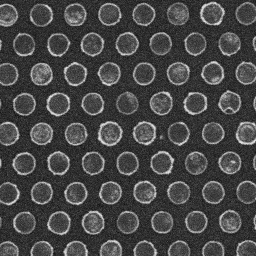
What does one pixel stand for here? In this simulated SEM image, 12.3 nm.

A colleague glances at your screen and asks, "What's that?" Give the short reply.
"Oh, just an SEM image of a regular array of raised bodies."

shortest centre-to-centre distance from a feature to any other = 416 nm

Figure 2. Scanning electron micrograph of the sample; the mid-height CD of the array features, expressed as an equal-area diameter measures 273 nm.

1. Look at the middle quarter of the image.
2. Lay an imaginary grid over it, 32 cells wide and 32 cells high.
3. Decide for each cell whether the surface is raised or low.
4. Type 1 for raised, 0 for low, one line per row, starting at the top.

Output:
01111000011110000011110000011110
11111100011111000111111000111110
11111100011111000111111000111110
11111000011111000011110000111110
01111000011110000011110000011100
00000000000000000000000000000000
00000000000000000000000000000000
00000011100000011000000111000001
10000111100000111100001111100001
10001111110001111100001111100011
10001111110001111100001111100011
10000111110000111100001111100011
00000001000000000000000111000001
00000000000000000000000000000000
00000000001110000001100000000000
01111000011111000011111000011110
01111000011111000011111000111110
11111100011111100111111000111110
01111000011111000011111000111110
01111000011110000001110000011100
00000000000000000000000000000000
00000000000000000000000000000000
00000011100000111100000111000000
10000111110001111100001111100001
10000111110001111100001111100011
10000111110001111100001111100011
10000111110000111100001111100001
00000011000000001000000000000000
00000000000000000000000000000000
00000000000000000000100000001100
01111000001111000011111000111110
11111000011111000011111000111110